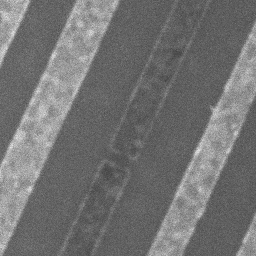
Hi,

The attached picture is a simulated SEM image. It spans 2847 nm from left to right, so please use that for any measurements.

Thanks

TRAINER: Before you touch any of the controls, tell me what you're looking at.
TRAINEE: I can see one or a few lines or trenches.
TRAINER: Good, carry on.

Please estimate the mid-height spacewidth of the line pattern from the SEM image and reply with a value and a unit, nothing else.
591 nm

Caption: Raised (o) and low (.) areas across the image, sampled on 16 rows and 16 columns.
oo...oo....oo...
o...ooo...oo....
o...oo....oo....
...ooo...oo....o
...oo....oo....o
..ooo....oo...oo
..oo....oo....oo
.ooo....oo...oo.
.oo....oo....oo.
.oo....oo...oo..
ooo...oo....oo..
oo....oo...oo...
oo...oo....oo...
o....oo...oo....
o...oo....oo....
....oo....o....o